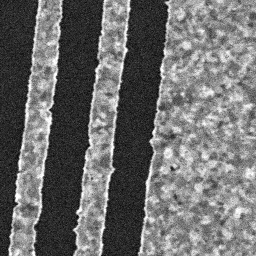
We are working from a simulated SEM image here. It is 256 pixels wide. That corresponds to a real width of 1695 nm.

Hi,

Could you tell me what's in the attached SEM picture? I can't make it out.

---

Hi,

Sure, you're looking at one or a few lines or trenches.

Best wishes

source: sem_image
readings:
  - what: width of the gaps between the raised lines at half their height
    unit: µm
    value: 0.263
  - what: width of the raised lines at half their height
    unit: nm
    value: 163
